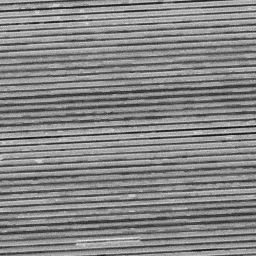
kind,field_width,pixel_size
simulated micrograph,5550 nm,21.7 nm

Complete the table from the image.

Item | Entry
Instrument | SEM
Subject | parallel lines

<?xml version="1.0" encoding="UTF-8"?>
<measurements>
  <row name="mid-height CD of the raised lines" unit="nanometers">83.9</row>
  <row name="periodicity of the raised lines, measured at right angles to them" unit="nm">146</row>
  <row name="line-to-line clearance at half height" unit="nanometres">62.2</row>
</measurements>